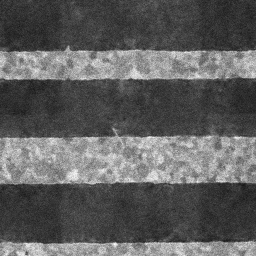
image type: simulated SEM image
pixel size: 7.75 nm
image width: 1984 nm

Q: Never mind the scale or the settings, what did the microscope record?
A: one or a few lines or trenches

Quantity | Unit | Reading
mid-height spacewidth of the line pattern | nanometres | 461